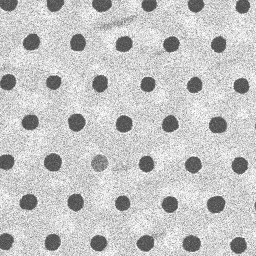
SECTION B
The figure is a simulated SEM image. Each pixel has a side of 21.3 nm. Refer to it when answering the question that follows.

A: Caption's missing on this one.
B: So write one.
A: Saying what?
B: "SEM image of a regular array of holes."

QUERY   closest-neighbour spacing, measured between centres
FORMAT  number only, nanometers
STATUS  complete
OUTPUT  971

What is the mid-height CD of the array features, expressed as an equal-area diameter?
367 nm